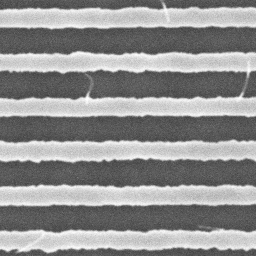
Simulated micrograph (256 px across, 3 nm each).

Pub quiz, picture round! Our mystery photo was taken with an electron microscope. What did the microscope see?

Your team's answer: lines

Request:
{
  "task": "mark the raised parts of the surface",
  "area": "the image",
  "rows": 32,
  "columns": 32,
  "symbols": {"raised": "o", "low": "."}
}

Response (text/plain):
................................
oooooooooooooooooooooooooooooooo
oooooooooooooooooooooooooooooooo
......o.........................
................................
................................
.........oo.....................
oooooooooooooooooooooooooooooooo
oooooooooooooooooooooooooooooooo
................................
................................
................................
oooooooooooooooooooooooooooooooo
oooooooooooooooooooooooooooooooo
oooo.ooooooo..oo.o.o.oooo.....oo
................................
................................
................................
oooooooooooooooooooooooooooooooo
oooooooooooooooooooooooooooooooo
................................
................................
................................
oooooooooooooooooooooooooooooooo
oooooooooooooooooooooooooooooooo
oooooooooooooooooooooooooooooooo
................................
................................
................................
oooooooooooooooooooooooooooooooo
oooooooooooooooooooooooooooooooo
......o.........................